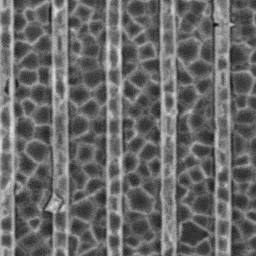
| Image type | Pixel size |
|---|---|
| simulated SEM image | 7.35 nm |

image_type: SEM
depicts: parallel lines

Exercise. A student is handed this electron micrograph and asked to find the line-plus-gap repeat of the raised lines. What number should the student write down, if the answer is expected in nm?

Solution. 399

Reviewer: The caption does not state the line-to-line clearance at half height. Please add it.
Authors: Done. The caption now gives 288 nm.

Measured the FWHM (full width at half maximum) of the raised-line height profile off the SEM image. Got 0.109 um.